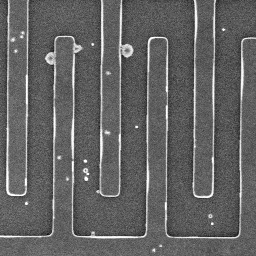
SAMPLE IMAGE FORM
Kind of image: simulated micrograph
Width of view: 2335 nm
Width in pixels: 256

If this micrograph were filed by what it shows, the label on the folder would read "groups of lines, slits or small figures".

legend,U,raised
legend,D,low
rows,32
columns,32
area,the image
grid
DUUDDDDDDDDDDUUDDDDDDDDDUUUDDDDD
DUUDDDDDDDDDDUUDDDDDDDDDUUUDDDDD
DUUDDDDDDDDDDUUDDDDDDDDDDUUDDDDD
DUUDDDDDDDDDDUUDDDDDDDDDDUUDDDDD
DUUDDDDDDDDDDUUDDDDDDDDDUUUDDDDD
DUUDDDDUUDDDDUUDDDDUUDDDUUUDDDUU
DUUDDDDUUDDDDUUUDDDUUDDDUUUDDDUU
DUUDDDUUUDDDDUUDDDDUUDDDUUUDDDUU
DUUDDDDUUDDDDUUDDDDUUDDDUUUDDDUU
DUUDDDDUUDDDDUUDDDDUUDDDUUUDDDUU
DUUDDDDUUDDDDUUDDDUUUDDDUUUDDDUU
DUUDDDDUUDDDDUUDDDUUUDDDUUUDDDUU
DUUDDDDUUDDDDUUDDDUUUDDDUUUDDDUU
DUUDDDDUUDDDDUUDDDUUUDDDUUUDDDUU
DUUDDDDUUDDDDUUDDDUUUDDDUUUDDDUU
DUUDDDDUUDDDDUUDDDUUUDDDUUUDDDUU
DUUDDDDUUDDDDUUDDDUUUDDDUUUDDDUU
DUUDDDDUUDDDDUUDDDUUUDDDUUUDDDUU
DUUDDDDUUDDDDUUDDDUUUDDDUUUDDDUU
DUUDDDDUUDDDDUUDDDUUUDDDUUUDDDUU
DUUDDDDUUDDDDUUDDDUUUDDDUUUDDDUU
DUUDDDDUUDDDDUUDDDUUUDDDUUUDDDUU
DUUDDDDUUDDDDUUDDDUUUDDDUUUDDDUU
DUUDDDDUUDDDDUUDDDUUUDDDUUUDDDUU
DDDDDDDUUDDDDUDDDDUUUDDDDUDDDDUU
DDDDDDDUUDDDDDDDDDUUUDDDDDDDDDUU
DDDDDDDUUDDDDDDDDDUUUDDDDDDDDDUU
DDDDDDDUUDDDDDDDDDUUUDDDDDDDDDUU
DDDDDDDUUDDDDDDDDDUUUDDDDDDDDDUU
DDDDDUUUUUDDDDDDDDUUUDDDDDDDDDUU
UUUUUUUUUUUUUUUUUUUUUUUUUUUUUUUU
UUUUUUUUUUUUUUUUUUUUUUUUUUUUUUUU